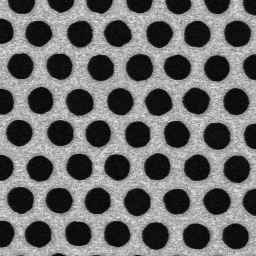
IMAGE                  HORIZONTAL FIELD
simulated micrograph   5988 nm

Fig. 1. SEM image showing a regular array of holes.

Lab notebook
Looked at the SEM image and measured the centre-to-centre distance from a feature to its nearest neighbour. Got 0.882 microns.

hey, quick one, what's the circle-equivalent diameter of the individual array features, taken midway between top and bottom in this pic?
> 0.619 um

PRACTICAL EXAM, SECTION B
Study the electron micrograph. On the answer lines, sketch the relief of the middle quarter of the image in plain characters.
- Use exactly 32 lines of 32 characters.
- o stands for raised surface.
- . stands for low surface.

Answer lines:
..oooo.......oo.......ooo.......
..oooo.......ooo......ooo.......
..oooo......oooo......oooo.....o
ooooooo....oooooo....oooooo...oo
oooooooooooooooooooooooooooooooo
oooooooooooooooooooooooooooooooo
ooo..ooooooo....oooooo...oooooo.
o.....ooooo......oooo.....oooo..
o......oooo......ooo.......ooo..
.......oooo.......oo.......ooo..
o......oooo......ooo.......ooo..
o......ooooo.....oooo......oooo.
oo...oooooooo..ooooooo...ooooooo
oooooooooooooooooooooooooooooooo
.oooooo...ooooooo..ooooooo...ooo
..oooo.....ooooo.....ooooo....oo
..ooo.......ooo......oooo......o
..ooo.......ooo.......ooo......o
..ooo......oooo.......ooo......o
..oooo.....ooooo.....oooo......o
ooooooo...ooooooo...ooooooo...oo
oooooooooooooooooooooooooooooooo
ooo..ooooooo..oooooooo..oooooooo
o.....ooooo.....ooooo.....ooooo.
o......ooo......oooo......oooo..
.......ooo.......ooo.......ooo..
o......ooo......oooo......oooo..
o......oooo.....oooo......oooo..
oo....oooooo...oooooo....oooooo.
oooooooooooooooooooooooooooooooo
oooooooooooooooooooooooooooooooo
.oooooo...ooooooo...oooooo....oo